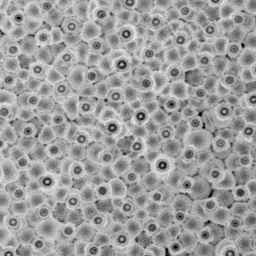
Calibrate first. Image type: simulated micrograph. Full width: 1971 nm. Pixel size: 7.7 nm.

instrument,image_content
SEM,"a regular array of holes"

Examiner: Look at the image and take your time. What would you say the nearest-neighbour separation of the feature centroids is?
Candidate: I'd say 143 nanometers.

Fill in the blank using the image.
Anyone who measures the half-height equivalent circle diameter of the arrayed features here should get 9.23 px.